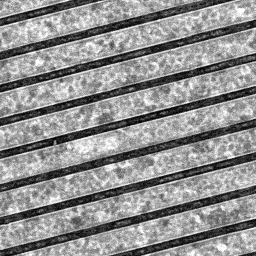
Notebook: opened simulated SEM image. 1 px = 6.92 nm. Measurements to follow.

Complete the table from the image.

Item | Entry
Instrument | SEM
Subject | parallel lines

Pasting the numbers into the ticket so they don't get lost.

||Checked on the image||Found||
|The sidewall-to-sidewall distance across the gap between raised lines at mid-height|61.2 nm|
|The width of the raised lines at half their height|0.164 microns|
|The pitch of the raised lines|222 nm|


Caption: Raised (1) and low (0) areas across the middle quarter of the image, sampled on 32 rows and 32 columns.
10000000001111111111111111111111
00000011111111111111111111111110
00011111111111111111111111000000
11111111111111111111110000000000
11111111111111111110000000001111
11111111111111100000000011111111
11111111111100000000111111111111
11111110000000001111111111111111
11100000000011111111111111111111
00000000111111111111111111111111
00001111111111111111111111110000
11111111111111111111111100000000
11111111111111111111000000000111
11111111111111100000000011111111
11111111111000000000011111111111
11111110000000000111111111111111
11100000000001111111111111111111
00000000011111111111111111111111
00000011111111111111111111111000
00111111111111111111111110000000
11111111111111111111100000000011
11111111111111111000000000111111
11111111111110000000001111111111
11111111100000000011111111111111
11111000000000111111111111111111
10000000001111111111111111111111
00000011111111111111111111111000
00011111111111111111111110000000
11111111111111111111110000000000
11111111111111111100000000001111
11111111111111000000000011111111
11111111111000000000111111111111